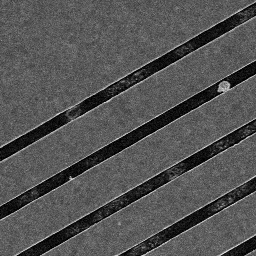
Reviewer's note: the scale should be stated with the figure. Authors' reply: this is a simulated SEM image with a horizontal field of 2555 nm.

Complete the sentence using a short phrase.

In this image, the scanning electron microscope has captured parallel lines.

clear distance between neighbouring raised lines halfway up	11.8	pixels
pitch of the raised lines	0.505	um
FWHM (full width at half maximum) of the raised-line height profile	386	nm